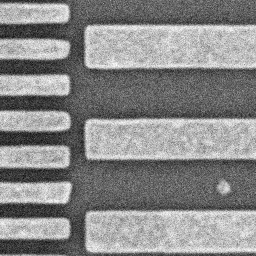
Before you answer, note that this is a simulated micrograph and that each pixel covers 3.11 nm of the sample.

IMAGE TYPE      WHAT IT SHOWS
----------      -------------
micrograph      wiring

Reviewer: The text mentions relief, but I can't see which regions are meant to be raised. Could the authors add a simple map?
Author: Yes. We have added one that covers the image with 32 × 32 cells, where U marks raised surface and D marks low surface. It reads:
UUUUUDDDDDDDDDDDDDDDDDDDDDDDDDDD
UUUUUUUUUDDDDDDDDDDDDDDDDDDDDDDD
UUUUUUUUDDDDDDDDDDDDDDDDDDDDDDDD
DDDDDDDDDDDUUUUUUUUUUUUUUUUUUUUU
DDDDDDDDDDDUUUUUUUUUUUUUUUUUUUUU
UUUUUUUUUDDUUUUUUUUUUUUUUUUUUUUU
UUUUUUUUUDDUUUUUUUUUUUUUUUUUUUUU
DDDDDDDDDDDUUUUUUUUUUUUUUUUUUUUU
DDDDDDDDDDDDDDDDDDDDDDDDDDDDDDDD
DDDDUUUUDDDDDDDDDDDDDDDDDDDDDDDD
UUUUUUUUUDDDDDDDDDDDDDDDDDDDDDDD
UUUUUUUUUDDDDDDDDDDDDDDDDDDDDDDD
DDDDDDDDDDDDDDDDDDDDDDDDDDDDDDDD
DDDDDDDDDDDDDDDDDDDDDDDDDDDDDDDD
UUUUUUUUUDDDDDDDDDDDDDDDDDDDDDDD
UUUUUUUUUDDUUUUUUUUUUUUUUUUUUUUU
DDDDDDDDDDDUUUUUUUUUUUUUUUUUUUUU
DDDDDDDDDDDUUUUUUUUUUUUUUUUUUUUU
UUUUUUUUDDDUUUUUUUUUUUUUUUUUUUUU
UUUUUUUUUDDUUUUUUUUUUUUUUUUUUUUU
UUUUUUUUUDDDDDDDDDDDDDDDDDDDDDDD
DDDDDDDDDDDDDDDDDDDDDDDDDDDDDDDD
DDDDDDDDDDDDDDDDDDDDDDDDDDDDDDDD
UUUUUUUUUDDDDDDDDDDDDDDDDDDDDDDD
UUUUUUUUUDDDDDDDDDDDDDDDDDDDDDDD
DDDDDDDDDDDDDDDDDDDDDDDDDDDDDDDD
DDDDDDDDDDDDDUUUUUDDUUUUUUUUUUUU
UUUUUUUUDDDUUUUUUUUUUUUUUUUUUUUU
UUUUUUUUUDDUUUUUUUUUUUUUUUUUUUUU
UUUUUUUUUDDUUUUUUUUUUUUUUUUUUUUU
DDDDDDDDDDDUUUUUUUUUUUUUUUUUUUUU
DDDDDDDDDDDUUUUUUDDDUUUUUUUUUDDD